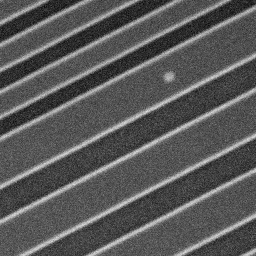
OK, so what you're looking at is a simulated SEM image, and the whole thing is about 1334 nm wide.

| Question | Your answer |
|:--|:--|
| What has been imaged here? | groups of lines, slits or small figures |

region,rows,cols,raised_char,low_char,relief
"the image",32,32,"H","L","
HHHHHLLLLLHHHHHHLLLLLHHHHHHHLLLL
HHHLLLLLHHHHHHLLLLLHHHHHHHLLLLLH
HLLLLLHHHHHHHLLLLHHHHHHHLLLLLHHH
LLLLHHHHHHHLLLLHHHHHHHLLLLLHHHHH
LLHHHHHHLLLLLHHHHHHHLLLLLHHHHHHH
HHHHHHHLLLLHHHHHHHLLLLLHHHHHHHHH
HHHHHLLLLLHHHHHHLLLLLHHHHHHHHHHH
HHHLLLLLHHHHHHLLLLLHHHHHHHHHHHHL
HLLLLLHHHHHHLLLLLHHHHHHHHHHHHLLL
LLLLHHHHHHLLLLLHHHHHHHHHHHHLLLLL
LLHHHHHHLLLLLHHHHHHHHHHHHLLLLLLL
HHHHHHLLLLLHHHHHHHHHHHHLLLLLLLLH
HHHHHLLLLHHHHHHHHHHHHLLLLLLLLHHH
HHHLLLLHHHHHHHHHHHHHLLLLLLLHHHHH
HLLLLHHHHHHHHHHHHLLLLLLLLHHHHHHH
LLLHHHHHHHHHHHHHLLLLLLLHHHHHHHHH
LHHHHHHHHHHHHHLLLLLLLLHHHHHHHHHH
HHHHHHHHHHHHLLLLLLLLHHHHHHHHHHHL
HHHHHHHHHHLLLLLLLLHHHHHHHHHHHLLL
HHHHHHHHLLLLLLLLHHHHHHHHHHHLLLLL
HHHHHHLLLLLLLLHHHHHHHHHHHLLLLLLL
HHHHLLLLLLLLHHHHHHHHHHHLLLLLLLLH
HHLLLLLLLLHHHHHHHHHHHLLLLLLLLHHH
LLLLLLLLHHHHHHHHHHHLLLLLLLLHHHHH
LLLLLLHHHHHHHHHHHHLLLLLLLLHHHHHH
LLLLHHHHHHHHHHHHLLLLLLLHHHHHHHHH
LLHHHHHHHHHHHHLLLLLLLLHHHHHHHHHH
HHHHHHHHHHHHLLLLLLLLHHHHHHHHHHHL
HHHHHHHHHHLLLLLLLLHHHHHHHHHHHLLL
HHHHHHHHLLLLLLLLHHHHHHHHHHHLLLLL
HHHHHHLLLLLLLLHHHHHHHHHHHLLLLLLL
HHHHLLLLLLLLHHHHHHHHHHHLLLLLLLLH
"